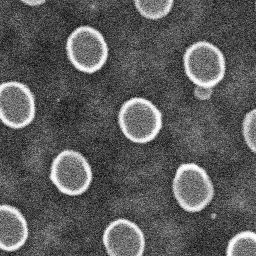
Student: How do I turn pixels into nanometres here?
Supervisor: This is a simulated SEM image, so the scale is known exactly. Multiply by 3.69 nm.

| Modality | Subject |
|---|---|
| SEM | raised bodies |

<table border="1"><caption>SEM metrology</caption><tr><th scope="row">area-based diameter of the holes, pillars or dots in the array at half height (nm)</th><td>156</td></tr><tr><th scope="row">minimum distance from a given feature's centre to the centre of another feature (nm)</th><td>314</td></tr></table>